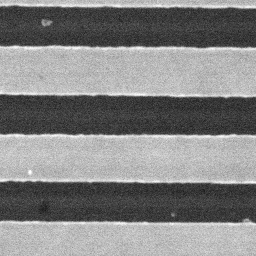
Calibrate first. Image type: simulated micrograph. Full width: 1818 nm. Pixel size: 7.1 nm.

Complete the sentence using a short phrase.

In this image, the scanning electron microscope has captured lines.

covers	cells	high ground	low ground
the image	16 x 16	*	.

................
................
................
****************
****************
****************
................
................
****************
****************
****************
................
................
................
****************
****************